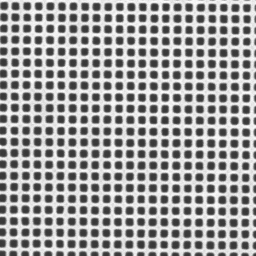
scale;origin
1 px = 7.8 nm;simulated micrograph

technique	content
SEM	a regular array of holes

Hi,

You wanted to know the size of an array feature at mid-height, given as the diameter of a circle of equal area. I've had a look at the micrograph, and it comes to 65.3 nanometers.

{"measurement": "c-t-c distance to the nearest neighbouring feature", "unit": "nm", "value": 86.4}